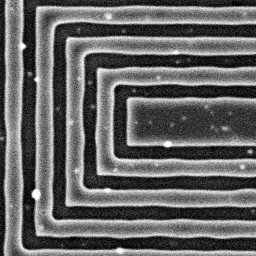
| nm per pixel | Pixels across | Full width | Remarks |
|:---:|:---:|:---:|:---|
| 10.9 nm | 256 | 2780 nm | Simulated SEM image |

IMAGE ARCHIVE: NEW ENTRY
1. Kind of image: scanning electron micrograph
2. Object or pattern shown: groups of lines, slits or small figures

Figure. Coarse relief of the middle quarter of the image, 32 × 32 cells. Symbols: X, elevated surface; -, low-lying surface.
-XXXX---------------------------
-XXXX---XXXXXXXXXXXXXXXXXXXXXXXX
-XXXX---XXXXXXXXXXXXXXXXXXXXXXXX
-XXXX---XXXXXXXXXXXXXXXXXXXXXXXX
-XXXX---XXXXXXXXXXXXXXXXXXXXXXXX
-XXXX----XXXX-------------------
-XXXX---XXXX--------------------
-XXXX---XXXX--------------------
-XXXX---XXXX--------------------
-XXX----XXXX----XXXXXXXXXXXXXXXX
-XXX----XXXX----XXXXXXXXXXXXXXXX
-XXX----XXXX----XXXXXXXXXXXXXXXX
-XXX----XXXX----XXXXXXXXXXXXXXXX
-XXX----XXXX----XXXXXXXXXXXXXXXX
-XXX----XXXX----XXXXXXXXXXXXXXXX
-XXXX---XXXX----XXXXXXXXXXXXXXXX
-XXXX---XXXX----XXXXXXXXXXXXXXXX
-XXXX---XXXX----XXXXXXXXXXXXXXXX
-XXXX---XXXX----XXXXXXXXXXXXXXXX
-XXXX---XXXX----XXXXXXXXXXXXXXXX
-XXXX---XXXX-------------XX-----
-XXXX---XXXX--------------------
-XXXX---XXXX--------------------
-XXXX---XXXXX-------------------
-XXXX---XXXXXXXXXXXXXXXXXXXXXXXX
-XXXX---XXXXXXXXXXXXXXXXXXXXXXXX
-XXXX---XXXXXXXXXXXXXXXXXXXXXXXX
-XXXX-------XXXXXXXXXXXXXXXXXXXX
-XXX----------------------------
-XXX----------------------------
-XXXX---------------------------
-XXXXX----XX--------------------